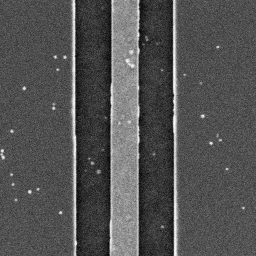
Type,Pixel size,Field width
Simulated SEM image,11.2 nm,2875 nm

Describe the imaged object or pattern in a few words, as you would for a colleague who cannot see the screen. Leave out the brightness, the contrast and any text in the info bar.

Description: lines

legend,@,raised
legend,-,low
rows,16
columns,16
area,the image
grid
@@@@@--@@--@@@@@
@@@@@--@@--@@@@@
@@@@@--@@--@@@@@
@@@@@--@@--@@@@@
@@@@@--@@--@@@@@
@@@@@--@@--@@@@@
@@@@@--@@--@@@@@
@@@@@--@@--@@@@@
@@@@@--@@--@@@@@
@@@@@--@@--@@@@@
@@@@@--@@--@@@@@
@@@@@--@@--@@@@@
@@@@@--@@--@@@@@
@@@@@--@@--@@@@@
@@@@@--@@--@@@@@
@@@@@--@@--@@@@@